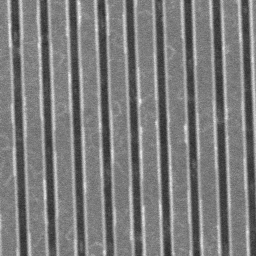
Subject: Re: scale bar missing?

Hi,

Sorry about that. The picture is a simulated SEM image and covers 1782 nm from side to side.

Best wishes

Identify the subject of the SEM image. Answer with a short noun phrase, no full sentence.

parallel lines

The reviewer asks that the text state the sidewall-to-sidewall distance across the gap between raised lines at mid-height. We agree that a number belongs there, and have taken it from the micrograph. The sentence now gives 70.4 nanometres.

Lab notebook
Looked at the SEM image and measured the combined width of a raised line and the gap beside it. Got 0.2 µm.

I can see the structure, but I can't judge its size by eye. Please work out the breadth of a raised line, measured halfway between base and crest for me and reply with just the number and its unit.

18.6 px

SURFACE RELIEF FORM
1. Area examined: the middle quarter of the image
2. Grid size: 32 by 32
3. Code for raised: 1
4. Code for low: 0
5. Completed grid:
10001111000111110011111001111100
10001111100111110011111001111100
10001111100111110011111001111100
10001111100111110001111000111100
10001111100111110001111000111100
10001111100111110001111000111100
11001111100111110011111000111100
11001111100111110011111000111100
11001111100011110001111000111100
11001111100011110001111000111100
11001111100011110001111000111100
11001111100011110001111000111100
11001111100011110001111000111100
11000111100011110001111000111110
11000111100011110001111000111110
11000111100011110001111000111110
11000111100011110001111000111110
11000111100011110001111000111110
11000111100011110001111100111110
11000111100011110001111100111110
11000111100011110001111100111110
11000111100011110001111100111110
11000111100011110001111100111110
11000111100011110001111100111110
11000111100011110001111100111110
11000111100011110001111100111110
11000111100011111001111100111110
11000111100011111001111100111110
11000111100011111001111100111110
11000111110011111001111100111110
11000111110011111001111100111110
11000111110011111000111100011110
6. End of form